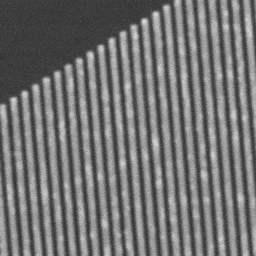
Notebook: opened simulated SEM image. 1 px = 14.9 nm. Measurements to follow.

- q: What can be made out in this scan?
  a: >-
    parallel lines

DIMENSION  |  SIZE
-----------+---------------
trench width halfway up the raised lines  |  89.1 nm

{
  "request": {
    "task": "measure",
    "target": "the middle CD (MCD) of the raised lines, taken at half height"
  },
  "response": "76.1 nanometers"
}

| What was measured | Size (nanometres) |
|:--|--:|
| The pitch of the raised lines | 171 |